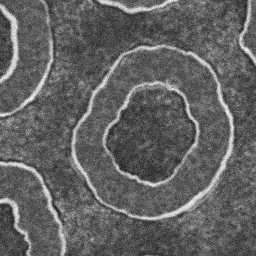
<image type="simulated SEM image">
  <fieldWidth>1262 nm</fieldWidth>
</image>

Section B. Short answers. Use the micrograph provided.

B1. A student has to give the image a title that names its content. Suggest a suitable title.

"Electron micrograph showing ring-shaped raised bodies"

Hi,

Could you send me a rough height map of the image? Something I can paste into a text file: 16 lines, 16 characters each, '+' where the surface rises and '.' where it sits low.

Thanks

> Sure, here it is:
+++.....++......
.++............+
.++............+
.++.....++++....
+++....++++++...
+++...+++.++++..
++....++....++..
.....++.....++..
.....++.....+++.
.....++.....++..
++...++....+++..
+++...+++++++...
+++...++++++....
.+++....+++.....
.+++............
..++............